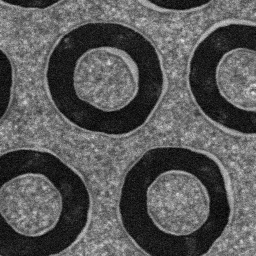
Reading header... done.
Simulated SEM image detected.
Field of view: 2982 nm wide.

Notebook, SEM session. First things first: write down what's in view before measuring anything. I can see ring-shaped grooves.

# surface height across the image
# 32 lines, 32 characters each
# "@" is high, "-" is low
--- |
@------@@@@@@@@@@@@-------@@@@@@
@@@@@@@@@@@@@@@@@@@@@@@@@@@@@@@@
@@@@@@@@@@@@@@@@@@@@@@@@@@@@@@@@
@@@@@@@@@-------@@@@@@@@@@@-----
@@@@@@@@----------@@@@@@@@------
@@@@@@@------------@@@@@@-------
@@@@@@@----@@@@-----@@@@----@@@@
-@@@@@----@@@@@@----@@@@----@@@@
-@@@@@----@@@@@@@---@@@@---@@@@@
--@@@@---@@@@@@@@----@@@---@@@@@
--@@@@---@@@@@@@@----@@@---@@@@@
-@@@@@----@@@@@@@---@@@@---@@@@@
-@@@@@@---@@@@@@----@@@@----@@@@
-@@@@@@-----@@@----@@@@@@-----@@
@@@@@@@@-----------@@@@@@@------
@@@@@@@@@---------@@@@@@@@@-----
@@@@@@@@@@@@----@@@@@@@@@@@@@---
@@@@@@@@@@@@@@@@@@@@@@@@@@@@@@@@
@@@@@@@@@@@@@@@@@@@-----@@@@@@@@
-------@@@@@@@@@@@--------@@@@@@
--------@@@@@@@@@----------@@@@@
---------@@@@@@@-----@@-----@@@@
-@@@@@----@@@@@@---@@@@@@---@@@@
@@@@@@@----@@@@----@@@@@@---@@@@
@@@@@@@@---@@@@---@@@@@@@@---@@@
@@@@@@@@---@@@@---@@@@@@@@---@@@
@@@@@@@@---@@@@----@@@@@@@---@@@
-@@@@@@----@@@@----@@@@@@@---@@@
--@@@@-----@@@@@----@@@@@---@@@@
----------@@@@@@------------@@@@
---------@@@@@@@@----------@@@@@
--------@@@@@@@@@@--------@@@@@@